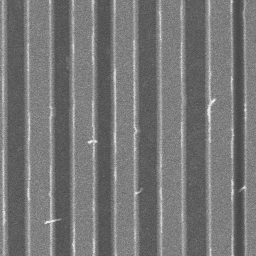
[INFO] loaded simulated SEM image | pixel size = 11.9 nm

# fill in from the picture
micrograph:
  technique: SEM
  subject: parallel lines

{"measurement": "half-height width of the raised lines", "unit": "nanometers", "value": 293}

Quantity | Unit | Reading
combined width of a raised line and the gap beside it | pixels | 45.3